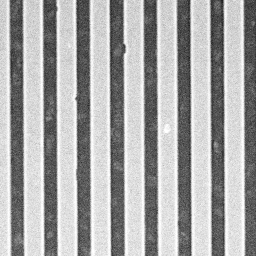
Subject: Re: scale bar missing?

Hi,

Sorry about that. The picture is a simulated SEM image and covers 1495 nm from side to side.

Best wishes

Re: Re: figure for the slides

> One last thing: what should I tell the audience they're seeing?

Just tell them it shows parallel lines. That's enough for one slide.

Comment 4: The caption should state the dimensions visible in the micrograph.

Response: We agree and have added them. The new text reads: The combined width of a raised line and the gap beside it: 195 nanometers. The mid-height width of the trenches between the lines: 0.0839 µm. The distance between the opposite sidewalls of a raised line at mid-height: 0.112 micrometres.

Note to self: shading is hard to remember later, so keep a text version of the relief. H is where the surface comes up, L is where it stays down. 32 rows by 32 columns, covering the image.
HLLHHLLHHLLHHHLLHHLLHHLLHHLLHHLL
HLLHHLLHHLLHHHLLHHLLHHLLHHLLHHLL
HLLHHLLHHLLHHHLLHHLLHHLLHHLLHHLL
HLLHHLLHHLLHHHLLHHLLHHLLHHLLHHLL
HLLHHLLHHLLHHHLLHHLLHHLLHHLLHHLL
HLLHHLLHHLLHHHLLHHLLHHLLHHLLHHLL
HLLHHLLHHLLHHHLLHHLLHHLLHHLLHHLL
HLLHHLLHHLLHHHLLHHLLHHLLHHLLHHLL
HLLHHLLHHLLHHHLLHHLLHHLLHHLLHHLL
HLLHHLLHHLLHHHLLHHLLHHLLHHLLHHLL
HLLHHLLHHLLHHHLLHHLLHHLLHHLLHHLL
HLLHHLLHHLLHHHLLHHLLHHLLHHLLHHLL
HLLHHLLHHLLHHHLLHHLLHHLLHHLLHHLL
HLLHHLLHHLLHHHLLHHLLHHLLHHLLHHLL
HLLHHLLHHLLHHHLLHHLLHHLLHHLLHHLL
HLLHHLLHHLLHHHLLHHLLHHLLHHLLHHLL
HLLHHLLHHLLHHHLLHHLLHHLLHHLLHHLL
HLLHHLLHHLLHHHLLHHLLHHLLHHLLHHLL
HLLHHLLHHLLHHHLLHHLLHHLLHHLLHHLL
HLLHHLLHHLLHHHLLHHLLHHLLHHLLHHLL
HLLHHLLHHLLHHHLLHHLLHHLLHHLLHHLL
HLLHHLLHHLLHHHLLHHLLHHLLHHLLHHLL
HLLHHLLHHLLHHHLLHHLLHHLLHHLLHHLL
HLLHHLLHHHLHHHLLHHLLHHLLHHLLHHLL
HLLHHLLHHHLHHHLLHHLLHHLLHHLLHHLL
HLLHHLLHHHLHHHLLHHLLHHLLHHLLHHLL
HLLHHLLHHHLHHHLLHHLLHHLLHHLLHHLL
HLLHHLLHHHLHHHLLHHLLHHLLHHLLHHLL
HLLHHLLHHHLHHHLLHHLLHHLLHHLLHHLL
HLLHHLLHHHLHHHLLHHLLHHLLHHLLHHHL
HLLHHLLHHHLHHHLLHHLLHHLLHHLLHHHL
HLLHHLLHHHLHHHLLHHLLHHLLHHLLHHHL